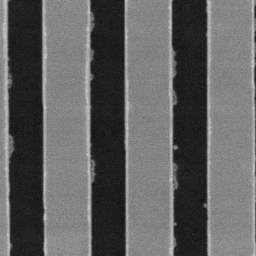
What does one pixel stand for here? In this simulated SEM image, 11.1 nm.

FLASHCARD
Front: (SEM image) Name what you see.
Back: lines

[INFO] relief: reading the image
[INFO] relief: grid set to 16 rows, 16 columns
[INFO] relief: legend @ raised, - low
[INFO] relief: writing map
---@@@--@@@--@@@
---@@@--@@@--@@@
---@@@--@@@--@@@
---@@@--@@@--@@@
---@@@--@@@--@@@
---@@@--@@@--@@@
---@@@--@@@--@@@
@--@@@--@@@--@@@
@--@@@--@@@--@@@
@--@@@--@@@--@@@
@--@@@--@@@--@@@
@--@@@--@@@--@@@
@--@@@--@@@--@@@
@--@@@--@@@--@@@
@--@@@--@@@--@@@
@--@@@--@@@--@@@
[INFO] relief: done